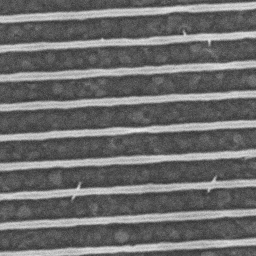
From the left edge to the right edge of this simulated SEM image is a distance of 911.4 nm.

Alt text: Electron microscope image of parallel lines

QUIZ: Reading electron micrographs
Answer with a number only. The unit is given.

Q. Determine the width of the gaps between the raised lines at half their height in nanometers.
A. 85.4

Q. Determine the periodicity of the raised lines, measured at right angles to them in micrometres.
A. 0.105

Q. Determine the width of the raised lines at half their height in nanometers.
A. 21.3